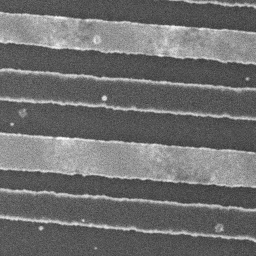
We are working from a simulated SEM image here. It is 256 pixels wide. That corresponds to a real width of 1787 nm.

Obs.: lines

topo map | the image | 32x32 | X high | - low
---------------------------XXXXX
--------------------------------
XXXXXXXXXXX---------------------
XXXXXXXXXXXXXXXXXXXXXXXXX-------
XXXXXXXXXXXXXXXXXXXXXXXXXXXXXXXX
---XXXXXXXXXXXXXXXXXXXXXXXXXXXXX
-------------X-XXXXXXXXXXXXXXXXX
---------------------------XXXXX
--------------------------------
XXXXXXXXXXXX--------------------
XXXXXXXXXXXXXXXXXXXXXXX---------
XXXXXXXXXXXXXXXXXXXXXXXXXXXXXXXX
-XXXXXXXXXXXXXXXXXXXXXXXXXXXXXXX
--------------XXXXXXXXXXXXXXXXXX
-------------------------XXXXXXX
--------------------------------
--------------------------------
XXXXXXXXXXX---------------------
XXXXXXXXXXXXXXXXXXXXXXXXX-------
XXXXXXXXXXXXXXXXXXXXXXXXXXXXXXXX
XXXXXXXXXXXXXXXXXXXXXXXXXXXXXXXX
-------XXXXXXXXXXXXXXXXXXXXXXXXX
-------------------XXXXXXXXXXXXX
--------------------------------
XXXXXXXXXXXXX-------------------
XXXXXXXXXXXXXXXXXXXXXXX---------
XXXXXXXXXXXXXXXXXXXXXXXXXXXXXXXX
---XXXXXXXXXXXXXXXXXXXXXXXXXXXXX
-------------XXXXXXXXXXXXXXXXXXX
--------------------------XXXXXX
--------------------------------
--------------------------------